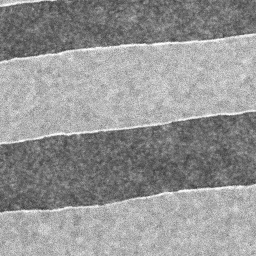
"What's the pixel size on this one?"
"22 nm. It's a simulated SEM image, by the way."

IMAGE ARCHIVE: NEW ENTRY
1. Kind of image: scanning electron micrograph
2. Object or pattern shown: one or a few lines or trenches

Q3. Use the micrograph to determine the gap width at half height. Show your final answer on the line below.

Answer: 1.56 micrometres